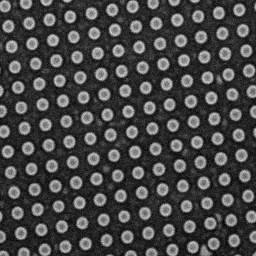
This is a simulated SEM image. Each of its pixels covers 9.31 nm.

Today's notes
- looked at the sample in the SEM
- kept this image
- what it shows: a regular array of raised bodies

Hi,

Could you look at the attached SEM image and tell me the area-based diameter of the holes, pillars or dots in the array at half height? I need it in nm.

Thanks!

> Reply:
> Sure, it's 106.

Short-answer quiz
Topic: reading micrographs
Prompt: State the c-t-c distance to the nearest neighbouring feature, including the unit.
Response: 190 nm